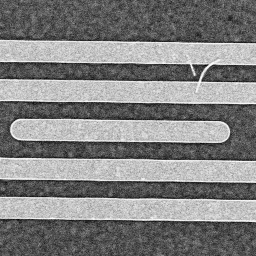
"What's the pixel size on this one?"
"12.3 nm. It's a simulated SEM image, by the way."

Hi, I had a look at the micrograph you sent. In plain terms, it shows groups of lines, slits or small figures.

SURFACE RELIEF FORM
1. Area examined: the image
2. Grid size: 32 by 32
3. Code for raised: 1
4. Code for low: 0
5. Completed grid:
00000000000000000000000000000000
00000000000000000000000000000000
00000000000000000000000000000000
00000000000000000000000000000000
00000000000000000000000000000000
11111111111111111111111111111111
11111111111111111111111111111111
11111111111111111111111111111111
00000000000000000000000000000000
00000000000000000000000000000000
11111111111111111111111111111111
11111111111111111111111111111111
11111111111111111111111111111111
00000000000000000000000000000000
00000000000000000000000000000000
00111111111111111111111111110000
01111111111111111111111111111000
00000001111111111111111111110000
00000000000000000000000000000000
00000000000000000000000000000000
11111111111111111111111111111111
11111111111111111111111111111111
00000000000111111111111111111111
00000000000000000000000000000000
00000000000000000000000000000000
11111111111111111111111111111111
11111111111111111111111111111111
00000000000000000000011111111111
00000000000000000000000000000000
00000000000000000000000000000000
00000000000000000000000000000000
00000000000000000000000000000000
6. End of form